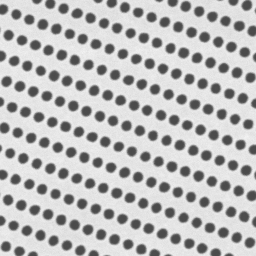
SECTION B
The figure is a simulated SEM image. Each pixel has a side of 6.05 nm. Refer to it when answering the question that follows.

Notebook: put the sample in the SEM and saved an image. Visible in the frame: a regular array of holes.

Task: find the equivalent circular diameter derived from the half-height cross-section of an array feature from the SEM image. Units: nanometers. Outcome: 65.4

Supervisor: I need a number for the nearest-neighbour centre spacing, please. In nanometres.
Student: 85.1